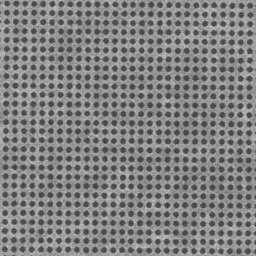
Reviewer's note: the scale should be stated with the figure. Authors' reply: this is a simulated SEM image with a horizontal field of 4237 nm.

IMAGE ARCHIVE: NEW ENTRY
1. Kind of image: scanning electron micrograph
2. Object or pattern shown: a regular array of holes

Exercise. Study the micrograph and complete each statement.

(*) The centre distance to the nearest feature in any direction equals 0.143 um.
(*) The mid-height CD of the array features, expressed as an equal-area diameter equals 110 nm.